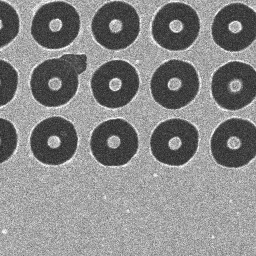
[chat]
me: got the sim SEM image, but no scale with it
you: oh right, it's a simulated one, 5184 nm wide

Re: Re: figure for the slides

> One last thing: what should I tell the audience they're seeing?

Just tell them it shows a regular array of ring-shaped grooves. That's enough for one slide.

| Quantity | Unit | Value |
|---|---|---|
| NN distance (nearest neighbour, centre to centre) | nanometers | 1170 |